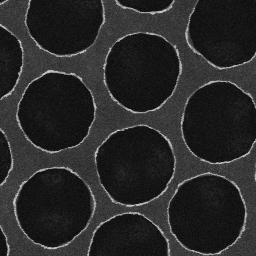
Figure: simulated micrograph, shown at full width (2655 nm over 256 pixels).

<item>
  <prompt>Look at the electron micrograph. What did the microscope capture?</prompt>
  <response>holes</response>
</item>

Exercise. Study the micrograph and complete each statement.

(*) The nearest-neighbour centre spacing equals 91.5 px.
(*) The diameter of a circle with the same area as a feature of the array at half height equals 795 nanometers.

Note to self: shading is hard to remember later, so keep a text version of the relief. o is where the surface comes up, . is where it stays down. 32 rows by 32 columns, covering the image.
oooo.........oo......oooo.......
ooo..........ooooooooooo........
ooo..........ooooooooooo........
oooo........oooooooooooo........
..oo........oooo....oooo........
..ooo......ooo.......ooo........
...ooo....oooo........ooo.......
...oooooooooo.........oooo.....o
...oooooooooo.........oooooooooo
..ooo....oooo.........oooooooooo
..oo......ooo.........oooo...ooo
.oo........ooo........oo......oo
ooo.........ooo......ooo.......o
oo..........oooo....ooo.........
oo..........ooooooooooo.........
ooo........oooooooooooo.........
ooo........oooo.....ooo.........
.ooo......ooo........oo.........
.oooo...oooo.........ooo.......o
.ooooooooooo..........ooo.....oo
.ooooooooooo..........oooooooooo
.oooo....ooo..........oooooooooo
oooo......ooo........ooo....oooo
ooo........oo........o........oo
oo.........ooo......oo........oo
oo..........oooo.oooo.........oo
oo.........oooooooooo..........o
oo.........ooo.....oo.........oo
ooo........o........o.........oo
.oo......ooo........oo........oo
.oooo...ooo..........oo......ooo
.oooooooooo..........oooo..ooooo